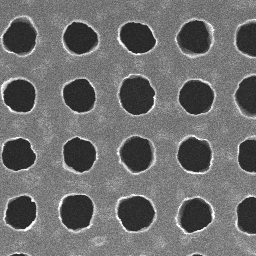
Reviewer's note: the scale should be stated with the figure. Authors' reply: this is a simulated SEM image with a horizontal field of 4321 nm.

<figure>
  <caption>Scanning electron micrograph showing a regular array of holes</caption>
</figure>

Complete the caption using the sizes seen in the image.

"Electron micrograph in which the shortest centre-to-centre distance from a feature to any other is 971 nm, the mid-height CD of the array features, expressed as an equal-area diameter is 563 nanometres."